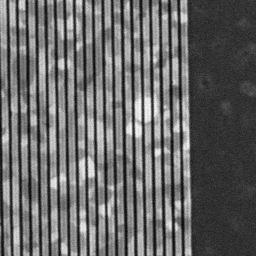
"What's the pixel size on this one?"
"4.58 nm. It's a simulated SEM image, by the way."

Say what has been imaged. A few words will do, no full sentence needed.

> parallel lines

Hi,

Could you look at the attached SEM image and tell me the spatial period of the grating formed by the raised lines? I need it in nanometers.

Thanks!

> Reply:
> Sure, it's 43.6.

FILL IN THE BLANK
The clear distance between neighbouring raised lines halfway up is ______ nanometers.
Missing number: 19.5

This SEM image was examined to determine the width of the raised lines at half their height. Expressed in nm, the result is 24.